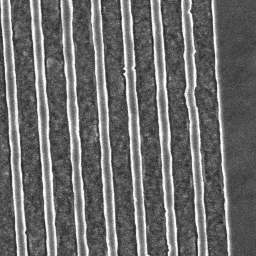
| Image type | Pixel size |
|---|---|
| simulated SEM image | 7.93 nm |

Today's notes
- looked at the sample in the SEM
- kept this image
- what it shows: parallel lines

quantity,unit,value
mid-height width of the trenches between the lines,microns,0.169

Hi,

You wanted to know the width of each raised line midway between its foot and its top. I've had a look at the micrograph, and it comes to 70.2 nanometers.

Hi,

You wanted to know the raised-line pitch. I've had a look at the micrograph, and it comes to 0.238 microns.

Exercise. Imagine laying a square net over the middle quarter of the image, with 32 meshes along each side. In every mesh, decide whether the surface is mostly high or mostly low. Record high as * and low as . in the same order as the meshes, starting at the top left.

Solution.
***.....**.....***.....**.....**
***.....**.....***.....**.....**
***.....**.....***.....**......*
.**.....**.....***.....**......*
.**.....**......**.....**......*
.**.....**......**.....**......*
.**.....**......**.....**......*
.**.....***.....**.....***....**
.**......*......**.....***.....*
.**......**.....**.....***.....*
.**......**.....**......**.....*
.**......**.....**......**.....*
.**......**.....***.....**.....*
.**......**.....***.....**.....*
..**.....**.....***.....**......
.**......**......**.....**......
.**......**......**.....**......
..**.....**......**.....**......
..**.....**......**.....**......
..**.....**......**.....**......
..**.....***.....**.....**......
..**......**.....**.....**......
..**......**.....**.....***.....
..**.....***.....**......**.....
..**......**.....**......**.....
..**......**.....**......**.....
..**......**.....**......**.....
..**......**.....**......**.....
..**......**.....**......**.....
..***.....**.....**......**.....
..***.....**......**.....**.....
..***.....**......**.....**.....